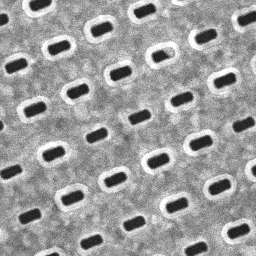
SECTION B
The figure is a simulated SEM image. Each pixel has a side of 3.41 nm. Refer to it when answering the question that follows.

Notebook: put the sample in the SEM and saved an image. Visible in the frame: a regular array of holes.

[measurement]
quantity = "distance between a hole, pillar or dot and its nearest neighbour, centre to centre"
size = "0.159 µm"